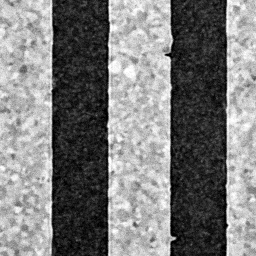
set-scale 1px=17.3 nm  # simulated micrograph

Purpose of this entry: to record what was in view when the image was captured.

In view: one or a few lines or trenches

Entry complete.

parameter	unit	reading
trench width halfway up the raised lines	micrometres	0.997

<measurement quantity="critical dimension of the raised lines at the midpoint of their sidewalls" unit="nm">1060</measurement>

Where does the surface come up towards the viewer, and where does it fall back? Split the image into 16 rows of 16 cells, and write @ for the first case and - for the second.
@@@----@@@@---@@
@@@----@@@@---@@
@@@----@@@@---@@
@@@----@@@@---@@
@@@----@@@@---@@
@@@----@@@@---@@
@@@----@@@@---@@
@@@----@@@@---@@
@@@----@@@@---@@
@@@----@@@@---@@
@@@----@@@@---@@
@@@----@@@@---@@
@@@----@@@@---@@
@@@----@@@@---@@
@@@----@@@@---@@
@@@----@@@@---@@